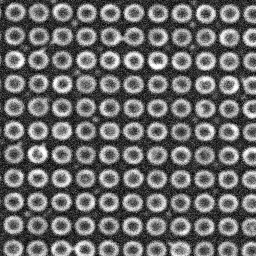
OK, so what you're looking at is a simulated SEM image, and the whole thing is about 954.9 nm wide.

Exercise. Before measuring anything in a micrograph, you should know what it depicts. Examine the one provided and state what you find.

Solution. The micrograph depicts a regular array of raised bodies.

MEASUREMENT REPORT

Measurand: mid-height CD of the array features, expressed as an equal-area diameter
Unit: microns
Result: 0.0627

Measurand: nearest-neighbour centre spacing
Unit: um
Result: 0.0877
